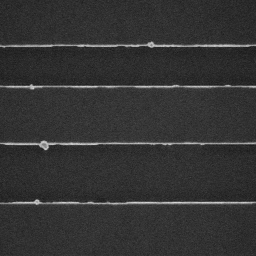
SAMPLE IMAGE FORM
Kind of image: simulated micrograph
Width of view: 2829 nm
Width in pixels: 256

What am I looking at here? lines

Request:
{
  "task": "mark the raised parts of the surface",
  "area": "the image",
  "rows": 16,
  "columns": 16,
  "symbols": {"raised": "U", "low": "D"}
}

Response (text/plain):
UUUUUUUUUUUUUUUU
UUUUUUUUUUUUUUUU
UUUUUUUUUUUUUUUU
DDDDDDDDDDDDDDDD
DDDDDDDDDDDDDDDD
UUUUUUUUUUUUUUUU
UUUUUUUUUUUUUUUU
UUUUUUUUUUUUUUUU
UUUUUUUUUUUUUUUU
DDDDDDDDDDDDDDDD
DDDDDDDDDDDDDDDD
DDDDDDDDDDDDDDDD
DDDDDDDDDDDDDDDD
UUUUUUUUUUUUUUUU
UUUUUUUUUUUUUUUU
UUUUUUUUUUUUUUUU